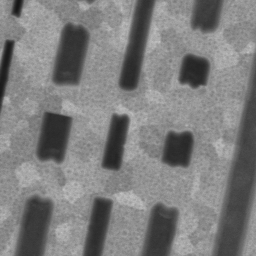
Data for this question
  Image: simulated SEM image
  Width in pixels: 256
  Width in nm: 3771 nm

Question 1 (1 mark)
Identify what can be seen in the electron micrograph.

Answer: parallel lines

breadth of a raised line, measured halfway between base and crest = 625 nm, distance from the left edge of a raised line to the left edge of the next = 932 nanometers